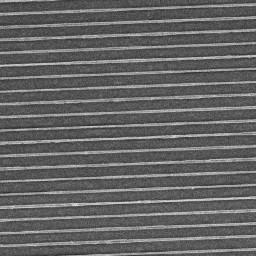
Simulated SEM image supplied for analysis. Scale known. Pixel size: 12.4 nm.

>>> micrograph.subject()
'parallel lines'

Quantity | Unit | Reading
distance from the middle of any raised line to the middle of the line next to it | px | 12.9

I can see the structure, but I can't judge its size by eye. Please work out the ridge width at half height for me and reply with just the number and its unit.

1.87 px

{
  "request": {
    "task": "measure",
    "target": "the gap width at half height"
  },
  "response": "139 nm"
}